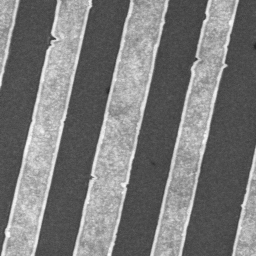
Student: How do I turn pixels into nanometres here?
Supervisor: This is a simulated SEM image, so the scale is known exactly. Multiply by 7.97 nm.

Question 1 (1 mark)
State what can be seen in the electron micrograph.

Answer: one or a few lines or trenches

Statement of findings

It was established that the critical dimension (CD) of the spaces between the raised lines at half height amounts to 323 nm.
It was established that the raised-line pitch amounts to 0.576 µm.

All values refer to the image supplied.